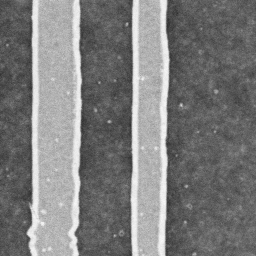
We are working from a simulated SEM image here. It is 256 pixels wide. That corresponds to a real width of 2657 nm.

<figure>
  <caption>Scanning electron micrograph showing one or a few lines or trenches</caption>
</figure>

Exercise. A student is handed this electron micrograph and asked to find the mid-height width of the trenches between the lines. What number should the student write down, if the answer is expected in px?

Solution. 58.4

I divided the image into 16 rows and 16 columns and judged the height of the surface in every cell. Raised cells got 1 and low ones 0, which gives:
0011100011000000
0011100011000000
0011100011000000
0011100011000000
0011100011000000
0011100011000000
0011100011000000
0011100011000000
0011100011000000
0011100011000000
0011100011000000
0011100011000000
0011100011000000
0011100011000000
0011100011000000
0011100011000000